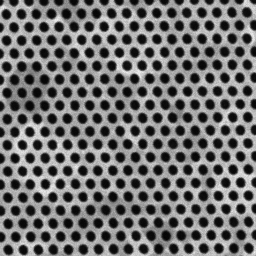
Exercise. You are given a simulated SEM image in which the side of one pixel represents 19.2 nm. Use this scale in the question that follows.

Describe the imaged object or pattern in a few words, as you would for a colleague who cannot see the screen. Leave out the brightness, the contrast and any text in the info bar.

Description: a regular array of holes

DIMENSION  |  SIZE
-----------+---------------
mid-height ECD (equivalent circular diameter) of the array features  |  203 nanometers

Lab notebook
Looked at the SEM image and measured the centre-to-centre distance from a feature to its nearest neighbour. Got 287 nm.